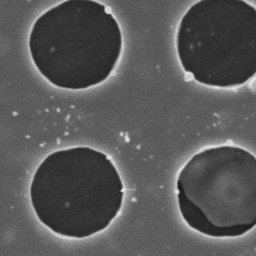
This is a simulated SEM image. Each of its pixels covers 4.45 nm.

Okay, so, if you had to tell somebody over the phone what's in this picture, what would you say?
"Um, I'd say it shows holes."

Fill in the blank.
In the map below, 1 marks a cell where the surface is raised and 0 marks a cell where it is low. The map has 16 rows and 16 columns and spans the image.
1110001111110000
1100000111100000
1100000011100000
1100000111100000
1110000111110000
1111011111111111
1111111111111111
1111111111111111
1111111111111111
1110001111111001
1100000111100000
1100000011100000
1100000011100000
1100000111100000
1110001111111001
1111111111111111